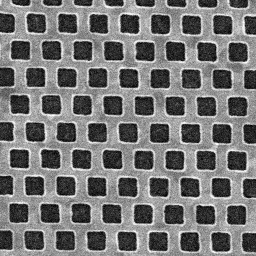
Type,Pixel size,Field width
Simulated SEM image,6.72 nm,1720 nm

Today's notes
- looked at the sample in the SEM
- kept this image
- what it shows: a regular array of holes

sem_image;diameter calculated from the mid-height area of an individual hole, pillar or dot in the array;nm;152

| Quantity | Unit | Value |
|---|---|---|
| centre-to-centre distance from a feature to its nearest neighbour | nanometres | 208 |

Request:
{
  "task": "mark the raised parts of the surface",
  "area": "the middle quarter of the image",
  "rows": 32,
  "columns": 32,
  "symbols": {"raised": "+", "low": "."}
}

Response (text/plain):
++++++++++++++++++++++++++++++++
...+++.....+++....++++....+++...
...+++.....+++.....++......++...
...+++.....+++.....+++.....++...
...+++.....+++.....++......++...
...+++.....+++.....+++....+++...
++++++++++++++++++++++++++++++++
++++++++++++++++++++++++++++++++
++.....+++.....+++....+++.....++
++.....+++.....++......++.....++
++.....+++.....++......++.....++
++.....+++.....++......++.....++
+++....+++.....+++.....+++....++
++++++++++++++++++++++++++++++++
+++++++...++++++++++++++++++++++
...+++.....++.....+++.....+++...
...+++.....+++.....++......++...
...+++.....+++.....++......++...
...+++.....+++.....++......++...
...++++....+++....++++....+++...
++++++++++++++++++++++++++++++++
++....++++....++++....++++...+++
++.....++......++.....+++.....++
++.....++......++......++.....++
++.....+++.....++......++.....++
++.....+++.....++......++.....++
+++++.++++++..++++....++++....++
++++++++++++++++++++++++++++++++
...+++....++++....++++....+++...
...+++.....++......++.....+++...
...+++.....++......++.....+++...
...+++.....++......++.....+++...